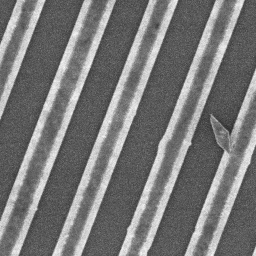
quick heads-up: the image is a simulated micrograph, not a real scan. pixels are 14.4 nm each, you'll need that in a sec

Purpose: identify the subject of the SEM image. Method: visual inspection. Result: one or a few lines or trenches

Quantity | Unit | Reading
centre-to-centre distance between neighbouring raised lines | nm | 887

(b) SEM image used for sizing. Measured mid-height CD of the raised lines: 0.3 um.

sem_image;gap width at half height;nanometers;587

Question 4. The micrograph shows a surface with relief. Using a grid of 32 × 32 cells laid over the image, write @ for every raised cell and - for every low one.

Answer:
--@@@------@@@-----@@@-----@@@--
--@@@-----@@@------@@------@@@--
--@@------@@@-----@@@-----@@@---
-@@@------@@@-----@@@-----@@@---
-@@------@@@-----@@@------@@----
@@@------@@@-----@@@-----@@@----
@@@-----@@@@-----@@------@@@----
@@------@@@-----@@@------@@-----
@@------@@@-----@@@-----@@@-----
@@-----@@@------@@------@@@-----
@------@@@-----@@@-----@@@------
@------@@@-----@@@-----@@@-----@
@-----@@@-----@@@------@@------@
------@@@-----@@@-----@@@------@
-----@@@@-----@@------@@@-----@@
-----@@@-----@@@-----@@@--@@--@@
-----@@@-----@@@-----@@@---@-@@@
----@@@-----@@@------@@@---@@@@@
----@@@-----@@@-----@@@-----@@@-
---@@@@-----@@------@@@-----@@@-
---@@@-----@@@------@@------@@@-
---@@@-----@@@-----@@@------@@--
--@@@------@@------@@@-----@@@--
--@@@-----@@@-----@@@------@@@--
--@@@-----@@@-----@@@-----@@@---
-@@@-----@@@------@@------@@@---
-@@@-----@@@-----@@@------@@----
@@@@-----@@------@@@-----@@@----
@@@-----@@@-----@@@------@@@----
@@@-----@@@-----@@@-----@@@-----
@@------@@------@@------@@@-----
@@-----@@@-----@@@------@@------